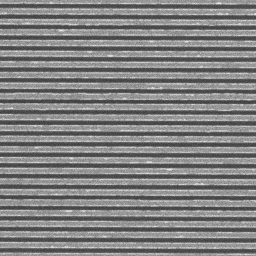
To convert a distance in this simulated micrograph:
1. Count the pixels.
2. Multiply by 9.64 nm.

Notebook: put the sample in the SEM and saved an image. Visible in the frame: parallel lines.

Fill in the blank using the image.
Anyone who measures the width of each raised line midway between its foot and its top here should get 0.0651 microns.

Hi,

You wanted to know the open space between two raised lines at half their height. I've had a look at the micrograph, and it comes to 3.88 px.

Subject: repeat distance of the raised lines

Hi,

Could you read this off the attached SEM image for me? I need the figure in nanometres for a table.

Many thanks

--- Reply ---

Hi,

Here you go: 102